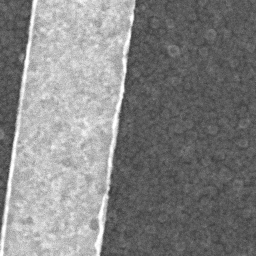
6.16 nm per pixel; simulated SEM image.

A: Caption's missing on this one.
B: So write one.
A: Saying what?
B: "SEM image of one or a few lines or trenches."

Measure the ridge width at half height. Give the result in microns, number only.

0.593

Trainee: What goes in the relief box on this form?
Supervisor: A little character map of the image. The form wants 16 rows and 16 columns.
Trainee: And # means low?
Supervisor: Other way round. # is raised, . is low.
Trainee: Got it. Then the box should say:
..######........
..######........
..######........
..######........
..######........
.#######........
.######.........
.######.........
.######.........
.######.........
.######.........
.######.........
.######.........
######..........
######..........
######..........